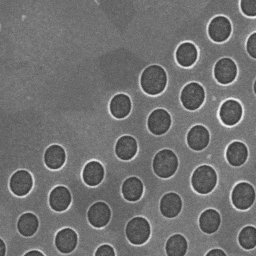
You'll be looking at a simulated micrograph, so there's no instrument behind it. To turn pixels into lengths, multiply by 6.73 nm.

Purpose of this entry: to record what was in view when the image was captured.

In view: a regular array of holes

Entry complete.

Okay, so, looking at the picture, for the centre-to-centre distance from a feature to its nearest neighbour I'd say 280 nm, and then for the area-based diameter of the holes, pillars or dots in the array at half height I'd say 164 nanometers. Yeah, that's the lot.